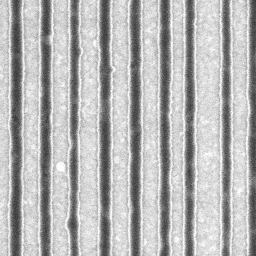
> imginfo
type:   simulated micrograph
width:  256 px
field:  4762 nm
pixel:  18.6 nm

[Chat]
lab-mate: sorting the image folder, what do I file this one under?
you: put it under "parallel lines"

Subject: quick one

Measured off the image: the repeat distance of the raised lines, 558 nm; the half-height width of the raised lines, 0.239 um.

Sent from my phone